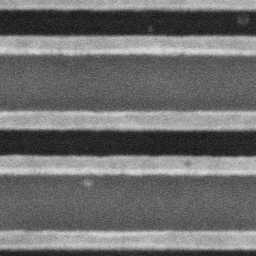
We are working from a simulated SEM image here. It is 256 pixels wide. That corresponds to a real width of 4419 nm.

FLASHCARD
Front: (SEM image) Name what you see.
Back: lines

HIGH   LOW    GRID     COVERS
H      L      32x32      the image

HHHHHHHHHHHHHHHHHHHHHHHHHHHHHHHH
LLLLLLLLLLLLLLLLLLLLLLLLLLLLLLLL
LLLLLLLLLLLLLLLLLLLLLLLLLLLLLLLL
LLLLLLLLLLLLLLLLLLLLLLLLLLLLLLLL
LLLLLLLLLLLLLLLLLLLLLLLLLLLLLLLL
HHHHHHHHHHHHHHHHHHHHHHHHHHHHHHHH
HHHHHHHHHHHHHHHHHHHHHHHHHHHHHHHH
LLLLLLLLLLLLLLLLLLLLLLLLLLLLLLLL
LLLLLLLLLLLLLLLLLLLLLLLLLLLLLLLL
LLLLLLLLLLLLLLLLLLLLLLLLLLLLLLLL
LLLLLLLLLLLLLLLLLLLLLLLLLLLLLLLL
LLLLLLLLLLLLLLLLLLLLLLLLLLLLLLLL
LLLLLLLLLLLLLLLLLLLLLLLLLLLLLLLL
LLLLLLLLLLLLLLLLLLLLLLLLLLLLLLLL
HHHHHHHHHHHHHHHHHHHHHHHHHHHHHHHH
HHHHHHHHHHHHHHHHHHHHHHHHHHHHHHHH
LLLLLLLLLLLLLLLLLLLLLLLLLLLLLLLL
LLLLLLLLLLLLLLLLLLLLLLLLLLLLLLLL
LLLLLLLLLLLLLLLLLLLLLLLLLLLLLLLL
LLHLLLLLLLLLLLLLLLLLLLLLLLLLLLLL
HHHHHHHHHHHHHHHHHHHHHHHHHHHHHHHH
HHHHHHHHHHHHHHHHHHHHHHHHHHHHHHHH
LLLLLLLLLLLLLLLLLLLLLLLLLLLLLLLL
LLLLLLLLLLLLLLLLLLLLLLLLLLLLLLLL
LLLLLLLLLLLLLLLLLLLLLLLLLLLLLLLL
LLLLLLLLLLLLLLLLLLLLLLLLLLLLLLLL
LLLLLLLLLLLLLLLLLLLLLLLLLLLLLLLL
LLLLLLLLLLLLLLLLLLLLLLLLLLLLLLLL
LLLLLLLLLLLLLLLLLLLLLLLLLLLLLLLL
HHHHHHHHHHHHHHHHHHHHHHHHHHHHHHHH
HHHHHHHHHHHHHHHHHHHHHHHHHHHHHHHH
LLLLLLLLLLLLLLLLLLLLLLLLLLLLLLLL